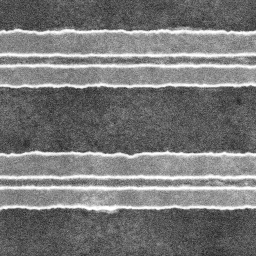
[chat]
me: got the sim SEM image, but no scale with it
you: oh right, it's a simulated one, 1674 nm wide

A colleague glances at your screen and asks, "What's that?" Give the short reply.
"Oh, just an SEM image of lines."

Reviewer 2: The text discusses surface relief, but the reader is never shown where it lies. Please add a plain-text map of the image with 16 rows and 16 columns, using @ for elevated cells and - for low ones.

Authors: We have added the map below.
----------------
----------------
@@@@@@@@@@@@@@@@
@@@@@@@@@@@@@@@@
@@@@@@@@@@@@@@@@
----------------
----------------
----------------
----------------
----------------
@@@@@@@@@@@@@@@@
@@@@@@@@@@@@@@@@
@@@@@@@@@@@@@@@@
----------------
----------------
----------------